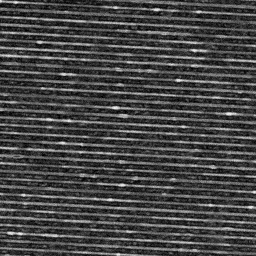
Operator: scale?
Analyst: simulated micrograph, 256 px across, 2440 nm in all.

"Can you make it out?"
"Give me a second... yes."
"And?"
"parallel lines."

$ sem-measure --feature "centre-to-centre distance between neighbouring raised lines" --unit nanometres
73.3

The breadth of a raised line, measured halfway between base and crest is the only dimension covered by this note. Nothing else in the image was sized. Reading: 16.6 nm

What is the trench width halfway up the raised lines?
54.7 nm